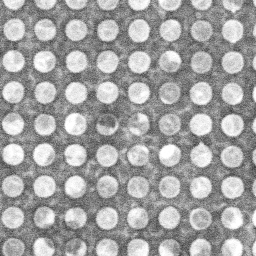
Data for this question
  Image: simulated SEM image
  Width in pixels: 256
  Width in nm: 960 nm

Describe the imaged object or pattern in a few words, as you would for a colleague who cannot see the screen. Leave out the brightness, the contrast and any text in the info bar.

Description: a regular array of raised bodies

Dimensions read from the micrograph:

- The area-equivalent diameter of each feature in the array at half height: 76.8 nm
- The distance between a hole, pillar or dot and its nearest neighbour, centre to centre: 116 nanometers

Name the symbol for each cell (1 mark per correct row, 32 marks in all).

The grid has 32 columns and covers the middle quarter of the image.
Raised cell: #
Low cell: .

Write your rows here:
.####....####....####...#####...
.####....###.....###.....###....
................................
................................
................................
.####....####....####....###....
.####...#####...#####...#####...
.#####..#####...#####...#####...
.####....####....####...#####...
..##......##.....###.....##.....
................................
................................
................................
.####....####....####....###....
.####...#####...#####...#####...
.####...#####...#####...#####...
.####....####...#####...#####...
..........#..............##.....
................................
................................
..##......................#.....
.####....####....####...#####...
.####...#####...#####...#####...
.####...#####...#####...#####...
.####....####....####...####....
................................
................................
................................
..##......##......#......###....
.####....####...####....####....
.####...#####...#####...#####...
.####....####...#####...#####...